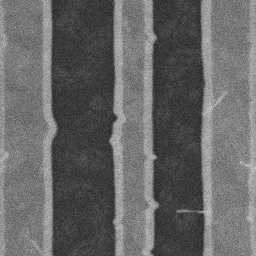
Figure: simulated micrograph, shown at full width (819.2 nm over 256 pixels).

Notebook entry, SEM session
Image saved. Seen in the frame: one or a few lines or trenches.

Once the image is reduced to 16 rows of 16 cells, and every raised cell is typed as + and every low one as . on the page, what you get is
+++....++....+++
+++....++....+++
+++....++....+++
+++....++....+++
+++....++....+++
+++....++....+++
+++....++....+++
+++....++....+++
+++....++....+++
+++....++....+++
+++....++....+++
+++....++....+++
+++....++....+++
+++....++....+++
+++....++....+++
+++....++....+++